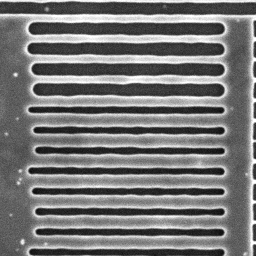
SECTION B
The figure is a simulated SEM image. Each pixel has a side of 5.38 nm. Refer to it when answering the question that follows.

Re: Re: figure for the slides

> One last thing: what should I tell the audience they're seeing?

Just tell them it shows groups of lines, slits or small figures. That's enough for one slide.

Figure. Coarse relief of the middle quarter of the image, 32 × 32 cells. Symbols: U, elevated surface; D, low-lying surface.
DDDDDDDDDDDDDDDDDDDDDDDDDDDDDDDD
DDDDDDDDDDDDDDDDDDDDDDDDDDDDDDDD
DDDDDDDDDDDDDDDDDDDDDDDDDDDDDDDD
UUUUUUUUUUUUUUUUUUUUUUUUUUUUUUUU
UUUUUUUUUUUUUUUUUUUUUUUUUUUUUUUU
DDDDDDDDDDDDDDDDDDDDDDDDDDDDDDDD
DDDDDDDDDDDDDDDDDDDDDDDDDDDDDDDD
DDDDDDDDDDDDDDDDDDDDDDDDDDDDDDDD
UUUUUUUUUUUUUUUUUUUUUUUUUUUUUUUU
UUUUUUUUUUUUUUUUUUUUUUUUUUUUUUUU
UUUDDDDDDDDDDDDDDDDDDDDDDDUUUUUD
DDDDDDDDDDDDDDDDDDDDDDDDDDDDDDDD
UUUDDDDDDUUUDDUUDDDDDDDDDDDDDDDD
UUUUUUUUUUUUUUUUUUUUUUUUUUUUUUUU
UUUUUUUUUUUUUUUUUUUUUUUUUUUUUUUU
DDDDDUUUDDUUDDDUUDDDUUDDDDDUUUDD
DDDDDDDDDDDDDDDDDDDDDDDDDDDDDDDD
DDDDDDDDDDDDDDDDDDDDDDDDDDDDDDDD
UUUUUUUUUUUUUUUUUUUUUUUUUUUUUUUU
UUUUUUUUUUUUUUUUUUUUUUUUUUUUUUUU
UUUUUUUUUUUUUUUUUUUUUUUUUUUUUUUU
DDDDDDDDDDDDDDDDDDDDDDDDDDDDDDDD
DDDDDDDDDDDDDDDDDDDDDDDDDDDDDDDD
UUUUUUUUUUUUUUUUUUUUUUUUUUUUUUUU
UUUUUUUUUUUUUUUUUUUUUUUUUUUUUUUU
UUUUUUUUUUUUUUUUUUUUUUUUUUUUUUUU
DDDDDDDDDDDDDDDDDDDDDDDDDDDDDDDD
DDDDDDDDDDDDDDDDDDDDDDDDDDDDDDDD
UUUUUUUUUUUUUUUUUUUUUUUUUUUUUUUU
UUUUUUUUUUUUUUUUUUUUUUUUUUUUUUUU
UUUUUUUUUUUUUUUUUUUUUUUUUUUUUUUU
DDDDDDDDDDDDDDDDDDDDDDDDDDDDDDDD